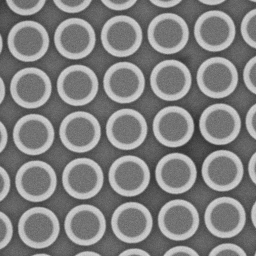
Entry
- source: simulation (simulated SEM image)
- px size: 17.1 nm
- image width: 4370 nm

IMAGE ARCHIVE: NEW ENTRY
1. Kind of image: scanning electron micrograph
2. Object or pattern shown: an array of small figures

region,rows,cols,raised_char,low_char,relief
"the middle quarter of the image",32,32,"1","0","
00111000000011111100000111111100
11111110000111111110001111111110
11111111001111111111001111111111
11111111001111111111001111111111
11111111001111111111001111111111
11111111001111111111001111111111
11111111001111111111001111111110
11111111000111111110000111111100
11111110000011111100000011111000
11111100000001111000000000000000
00000000000000000000000000000000
00000000000000111000000011111100
00111100000011111110000111111110
11111111000111111111000111111111
11111111000111111111001111111111
11111111100111111111101111111111
11111111100111111111101111111111
11111111100111111111100111111111
11111111100111111111000111111111
11111111000011111111000011111110
11111111000001111100000000111000
00111100000000000000000000000000
00000000000000000000000000011000
00000000000000111110000001111110
00111111000001111111000011111111
01111111100011111111100111111111
11111111100111111111100111111111
11111111110111111111100111111111
11111111110111111111100111111111
11111111110111111111100111111111
11111111100011111111100011111111
11111111100001111111000001111110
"